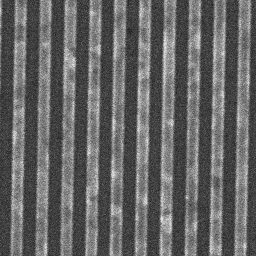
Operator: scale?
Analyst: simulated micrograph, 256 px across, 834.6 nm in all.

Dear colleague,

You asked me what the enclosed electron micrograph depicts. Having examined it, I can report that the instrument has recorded parallel lines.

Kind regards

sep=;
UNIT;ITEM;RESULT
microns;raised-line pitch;0.0811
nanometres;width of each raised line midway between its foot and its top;31.8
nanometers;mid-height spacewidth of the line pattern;47.6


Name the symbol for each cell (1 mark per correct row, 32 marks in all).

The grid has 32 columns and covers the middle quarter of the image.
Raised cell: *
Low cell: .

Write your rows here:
***....**....**....**....**....*
***....**....**....**....**....*
***...***....**....**....**....*
***...***....**....**....**....*
***...***....**....**....**....*
***...***....**....**....**....*
***...***....**....**....**....*
***...***....**....**....**....*
**....***...***....**....**....*
**....***...***....**....**....*
**....***...***....**....**....*
**....***...***....**....**....*
**....***...***....**....**....*
**....***...***....**....**....*
**....**....***....**....**....*
**....**....***....**....**....*
**....**....***....**....**....*
**....**....***....**....**....*
**....**....***....**....**....*
**....**....***....**....**....*
**....**....***....**....**....*
**....**....***....**....**....*
**....**....***....**....**....*
**....**....**.....**....**....*
**....**....**....***....**....*
**....**....**....***....**....*
**....**....***...***....**....*
**....**....***...***....**....*
**....**....***...***....**....*
**....**....**....***....**....*
**....**....**....***....**....*
**....**....**....***...***....*